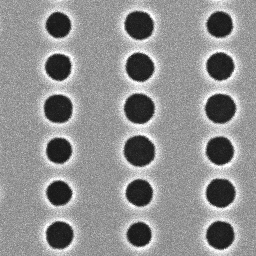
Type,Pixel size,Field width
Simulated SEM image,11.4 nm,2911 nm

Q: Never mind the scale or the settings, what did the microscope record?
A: a regular array of holes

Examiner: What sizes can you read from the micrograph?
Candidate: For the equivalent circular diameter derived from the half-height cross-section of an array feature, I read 335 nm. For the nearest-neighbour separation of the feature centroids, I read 476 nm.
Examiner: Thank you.